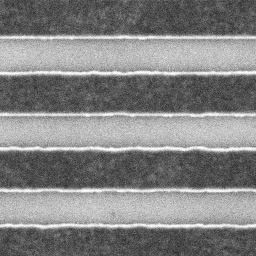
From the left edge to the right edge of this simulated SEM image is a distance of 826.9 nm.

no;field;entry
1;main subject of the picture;lines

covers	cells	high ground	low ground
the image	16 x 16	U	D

UUUUUUUUUUUUUUUU
UUUUUUUUUUUUUUUU
DDDDDDDDDDDDDDDD
DDDDDDDDDDDDDDDD
DDDDDDDDDDDDDDDD
UUUUUUUUUUUUUUUU
UUUUUUUUUUUUUUUU
DDDDDDDDDDDDDDDD
DDDDDDDDDDDDDDDD
UUUUUUUUUUUUUUUU
UUUUUUUUUUUUUUUU
UUUUUUUUUUUUUUUU
DDDDDDDDDDDDDDDD
DDDDDDDDDDDDDDDD
UUUUUUUUUUUUUUUU
UUUUUUUUUUUUUUUU